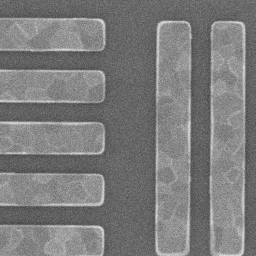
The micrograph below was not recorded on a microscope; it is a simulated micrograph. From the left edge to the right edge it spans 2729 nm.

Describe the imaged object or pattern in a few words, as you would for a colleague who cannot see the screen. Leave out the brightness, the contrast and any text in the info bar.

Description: groups of lines, slits or small figures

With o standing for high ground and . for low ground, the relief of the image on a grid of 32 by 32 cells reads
................................
................................
oooooooooooo....................
ooooooooooooo.......oooo..oooo..
ooooooooooooo.......oooo..oooo..
ooooooooooooo.......oooo..oooo..
....................oooo..oooo..
....................oooo..oooo..
....................oooo..oooo..
ooooooooooooo.......oooo..oooo..
ooooooooooooo.......oooo..oooo..
ooooooooooooo.......oooo..oooo..
ooooooooooooo.......oooo..oooo..
....................oooo..oooo..
....................oooo..oooo..
oooooooo..ooo.......oooo...ooo..
ooooooooooooo.......oooo...ooo..
ooooooooooooo.......oooo..oooo..
ooooooooooooo.......oooo..oooo..
....................oooo..oooo..
....................oooo..oooo..
....................oooo..oooo..
ooooooooooooo.......oooo..oooo..
ooooooooooooo.......oooo..oooo..
ooooooooooooo.......oooo..oooo..
.oooooo.oo..........oooo..oooo..
....................oooo..oooo..
....................oooo..oooo..
oooooooooooo........ooo...oooo..
ooooooooooooo.......ooo....ooo..
ooooooooooooo.......ooo....ooo..
ooooooooooooo.......ooo....ooo..